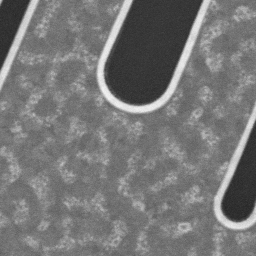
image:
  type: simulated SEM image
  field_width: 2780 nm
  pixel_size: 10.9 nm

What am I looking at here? one or a few lines or trenches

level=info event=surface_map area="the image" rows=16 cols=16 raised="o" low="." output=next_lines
..oooooo.....ooo
..ooooo.....oooo
.oooooo.....oooo
.oooooo.....oooo
oooooo.....ooooo
ooooooo....ooooo
ooooooo...oooooo
oooooooooooooooo
ooooooooooooooo.
ooooooooooooooo.
oooooooooooooo..
oooooooooooooo..
oooooooooooooo..
oooooooooooooo..
oooooooooooooooo
oooooooooooooooo